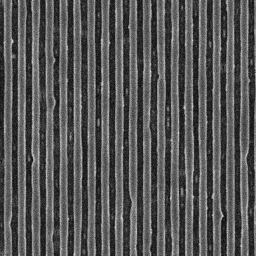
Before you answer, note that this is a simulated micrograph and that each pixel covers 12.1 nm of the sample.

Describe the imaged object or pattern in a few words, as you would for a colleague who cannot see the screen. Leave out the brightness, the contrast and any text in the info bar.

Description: parallel lines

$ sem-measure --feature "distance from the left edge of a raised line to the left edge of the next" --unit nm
168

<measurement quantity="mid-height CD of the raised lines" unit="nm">90.8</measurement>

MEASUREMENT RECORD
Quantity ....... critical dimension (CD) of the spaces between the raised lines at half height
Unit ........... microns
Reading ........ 0.0787